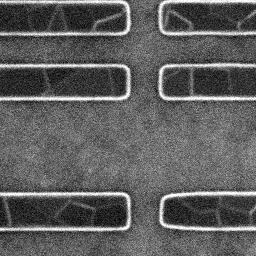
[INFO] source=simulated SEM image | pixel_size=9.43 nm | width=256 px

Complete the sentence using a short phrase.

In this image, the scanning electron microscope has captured wiring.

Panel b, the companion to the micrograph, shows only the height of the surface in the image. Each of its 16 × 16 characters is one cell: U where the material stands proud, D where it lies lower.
UUUUUUUUDDUUUUUU
UUUUUUUUDDUUUUUU
DDDDDDDDDDDDDDDD
DDDDDDDDDDDDDDDD
UUUUUUUUDDUUUUUU
UUUUUUUUDDUUUUUU
DDDDDDDDDDDDDDDD
DDDDDDDDDDDDDDDD
DDDDDDDDDDDDDDDD
DDDDDDDDDDDDDDDD
DDDDDDDDDDDDDDDD
DDDDDDDDDDDDDDDD
UUUUUUUUDDUUUUUU
UUUUUUUUDDUUUUUU
DDDDDDDDDDDDDDDD
DDDDDDDDDDDDDDDD